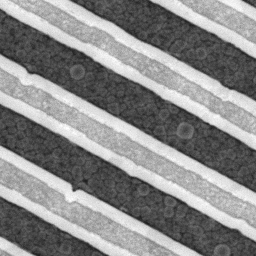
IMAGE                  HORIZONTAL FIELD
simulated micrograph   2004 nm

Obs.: one or a few lines or trenches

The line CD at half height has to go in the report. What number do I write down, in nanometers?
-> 238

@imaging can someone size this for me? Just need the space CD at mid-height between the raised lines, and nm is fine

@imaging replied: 399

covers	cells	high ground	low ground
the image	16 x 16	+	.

.+++.......++++.
..++++.......+++
....++++.......+
......++++......
+.......++++....
+++.......+++...
.++++.......+++.
...++++......+++
.....++++......+
......++++......
++......++++....
++++......++++..
.++++.......++++
...++++.......++
.....++++.......
+......++++.....